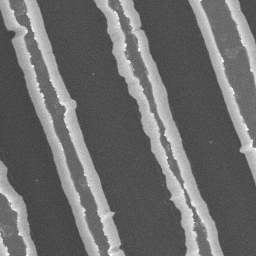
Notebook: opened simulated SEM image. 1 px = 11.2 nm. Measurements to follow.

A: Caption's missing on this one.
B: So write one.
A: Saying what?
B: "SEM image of one or a few lines or trenches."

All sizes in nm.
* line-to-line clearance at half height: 748